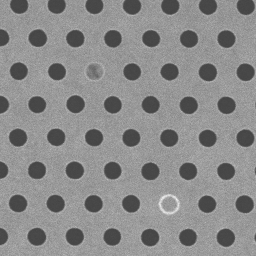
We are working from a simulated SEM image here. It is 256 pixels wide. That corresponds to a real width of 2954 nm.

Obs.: a regular array of holes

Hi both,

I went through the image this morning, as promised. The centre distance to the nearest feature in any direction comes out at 37.6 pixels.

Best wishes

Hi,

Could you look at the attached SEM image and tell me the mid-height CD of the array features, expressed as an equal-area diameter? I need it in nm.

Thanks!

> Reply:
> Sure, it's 207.